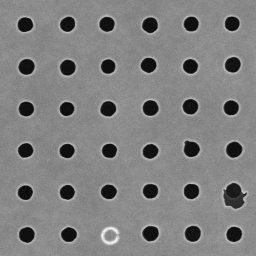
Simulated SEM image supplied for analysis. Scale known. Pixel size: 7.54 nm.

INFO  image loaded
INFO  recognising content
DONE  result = a regular array of holes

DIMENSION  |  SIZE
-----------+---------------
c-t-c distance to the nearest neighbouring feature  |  0.309 micrometres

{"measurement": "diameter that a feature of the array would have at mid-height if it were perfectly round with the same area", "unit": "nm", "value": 114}